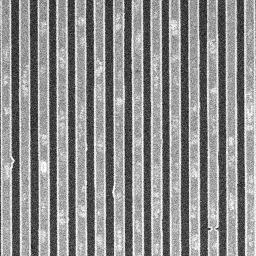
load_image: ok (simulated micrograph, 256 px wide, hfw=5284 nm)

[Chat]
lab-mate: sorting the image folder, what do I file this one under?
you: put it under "parallel lines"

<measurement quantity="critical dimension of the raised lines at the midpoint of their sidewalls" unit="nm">201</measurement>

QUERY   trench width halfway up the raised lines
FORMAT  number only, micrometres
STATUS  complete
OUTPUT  0.183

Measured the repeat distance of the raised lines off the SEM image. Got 387 nanometers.